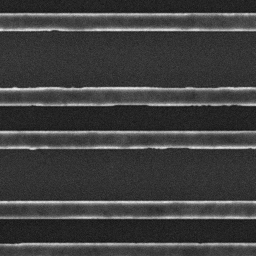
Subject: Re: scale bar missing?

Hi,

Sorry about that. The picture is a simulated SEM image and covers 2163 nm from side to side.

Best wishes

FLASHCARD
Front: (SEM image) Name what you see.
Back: lines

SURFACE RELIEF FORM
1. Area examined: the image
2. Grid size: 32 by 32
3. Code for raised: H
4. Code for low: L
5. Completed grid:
LLLLLLLLLLLLLLLLLLLLLLLLLLLLLLLL
LLLLLLLLLLLLLLLLLLLLLLLLLLLLLLLL
HHHHHHHHHHHHHHHHHHHHHHHHHHHHHHHH
HHHHHHHHHHHHHHHHHHHHHHHHHHHHHHHH
LLLLLLLLLLLLLLLLLLLLLLLLLLLLLLLL
LLLLLLLLLLLLLLLLLLLLLLLLLLLLLLLL
LLLLLLLLLLLLLLLLLLLLLLLLLLLLLLLL
LLLLLLLLLLLLLLLLLLLLLLLLLLLLLLLL
LLLLLLLLLLLLLLLLLLLLLLLLLLLLLLLL
LLLLLLLLLLLLLLLLLLLLLLLLLLLLLLLL
LLLLLLLLLLLLLLLLLLLLLLLLLLLLLLLL
HHHHHHHHHHHHHHHHHHHHHHHHHHHHHHHH
HHHHHHHHHHHHHHHHHHHHHHHHHHHHHHHH
LLLLLLLLLLLLLLLLLLLLLLLLLLLLLLLL
LLLLLLLLLLLLLLLLLLLLLLLLLLLLLLLL
LLLLLLLLLLLLLLLLLLLLLLLLLLLLLLLL
HHHHHHHHHHHHHHHHHHHHHHHHHHHHHHHH
HHHHHHHHHHHHHHHHHHHHHHHHHHHHHHHH
HHHHHHHHHHHHHHHHHHLHHLLHHHHHHHHL
LLLLLLLLLLLLLLLLLLLLLLLLLLLLLLLL
LLLLLLLLLLLLLLLLLLLLLLLLLLLLLLLL
LLLLLLLLLLLLLLLLLLLLLLLLLLLLLLLL
LLLLLLLLLLLLLLLLLLLLLLLLLLLLLLLL
LLLLLLLLLLLLLLLLLLLLLLLLLLLLLLLL
LLLLLLLLLLLLLLLLLLLLLLLLLLLLLLLL
HHHHHHHHHHHHHHHHHHHHHHHHHHHHHHHH
HHHHHHHHHHHHHHHHHHHHHHHHHHHHHHHH
LLLLLLLLLLLLLLLLLLLLLLLLLLLLLLLL
LLLLLLLLLLLLLLLLLLLLLLLLLLLLLLLL
LLLLLLLLLLLLLLLLLLLLLLLLLLLLLLLL
LLLHHHHHLLHHHHHLLLLLLLHHLLLLLHHL
HHHHHHHHHHHHHHHHHHHHHHHHHHHHHHHH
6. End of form